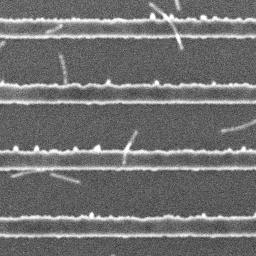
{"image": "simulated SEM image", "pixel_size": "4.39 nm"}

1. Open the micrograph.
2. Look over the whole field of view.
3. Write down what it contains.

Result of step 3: lines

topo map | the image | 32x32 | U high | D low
DDDDDDDDDDDDDDDDDDDDDDDDDDDDDDDD
DDDDDDDDDDDDDDDDDDDDDDDDDDDDDDDD
UUUUUUUUUUUUUUUUUUUUUUUUUUUUUUUU
UUUUUUUUUUUUUUUUUUUUUUUUUUUUUUUU
UUUUUUUUUUUUUUUUUUUUUUUUUUUUUUUU
DDDDDDDDDDDDDDDDDDDDDDDDDDDDDDDD
DDDDDDDDDDDDDDDDDDDDDDDDDDDDDDDD
DDDDDDDDDDDDDDDDDDDDDDDDDDDDDDDD
DDDDDDDDDDDDDDDDDDDDDDDDDDDDDDDD
DDDDDDDDDDDDDDDDDDDDDDDDDDDDDDDD
UUDDUDDDDUDUDUDDDDDUDDDUUDDDDUUD
UUUUUUUUUUUUUUUUUUUUUUUUUUUUUUUU
UUUUUUUUUUUUUUUUUUUUUUUUUUUUUUUU
DDDDDDDDDDDDDDDDDDDDDDDDDDDDDDDD
DDDDDDDDDDDDDDDDDDDDDDDDDDDDDDDD
DDDDDDDDDDDDDDDDDDDDDDDDDDDDDDDD
DDDDDDDDDDDDDDDDDDDDDDDDDDDDDDDD
DDDDDDDDDDDDDDDDDDDDDDDDDDDDDDDD
DDDDDDDDDDDDDDDDDDDDDDDDDDDDDDDD
UUUUUUUUUUUUUUUUUUUUUUUUUUUUUUUU
UUUUUUUUUUUUUUUUUUUUUUUUUUUUUUUU
DDDDDDDDDDDDDDDDDDDDDDDDDDDDDDDD
DDDDDDDDDDDDDDDDDDDDDDDDDDDDDDDD
DDDDDDDDDDDDDDDDDDDDDDDDDDDDDDDD
DDDDDDDDDDDDDDDDDDDDDDDDDDDDDDDD
DDDDDDDDDDDDDDDDDDDDDDDDDDDDDDDD
DDDDDDDDDDDDDDDDDDDDDDDDDDDDDDDD
UUUUUUUUUUUUUUUUUUUUUUUUUUUUUUUU
UUUUUUUUUUUUUUUUUUUUUUUUUUUUUUUU
UUUUUUUUUUUUUUUUUUUUUUUUUUUUUUUU
DDDDDDDDDDDDDDDDDDDDDDDDDDDDDDDD
DDDDDDDDDDDDDDDDDDDDDDDDDDDDDDDD